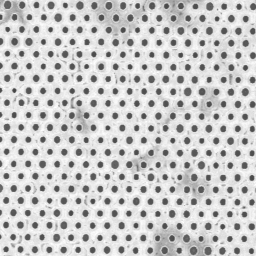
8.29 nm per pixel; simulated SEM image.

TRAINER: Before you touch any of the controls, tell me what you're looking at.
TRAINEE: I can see a regular array of holes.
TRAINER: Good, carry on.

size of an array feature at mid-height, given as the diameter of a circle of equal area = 52.9 nanometres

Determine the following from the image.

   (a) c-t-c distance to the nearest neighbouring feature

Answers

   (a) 0.115 µm